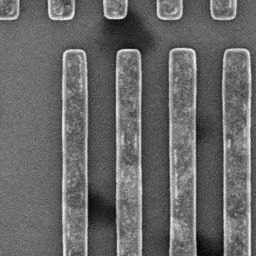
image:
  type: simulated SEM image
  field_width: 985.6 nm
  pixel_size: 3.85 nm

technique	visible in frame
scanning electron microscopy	wiring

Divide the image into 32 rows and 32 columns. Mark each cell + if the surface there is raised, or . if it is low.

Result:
++....+++....+++....+++...+++...
++....+++....+++....+++...+++...
................................
................................
................................
................................
........++.....++....+++....+++.
........+++....+++...+++....+++.
........+++....+++...+++....+++.
........+++....+++...+++....+++.
........+++....+++...+++....+++.
........+++....+++...+++....+++.
........+++....+++...+++....+++.
........+++....+++...+++....+++.
........+++....+++...+++....+++.
........+++....+++...+++....+++.
........+++....+++...+++....+++.
........+++....+++...+++....+++.
........+++....+++...+++....+++.
........+++....+++...+++....+++.
........+++....+++...+++....+++.
........+++....+++...+++....+++.
........+++....+++...+++....+++.
........+++....+++...+++....+++.
........+++....+++...+++....+++.
........+++....+++...+++....+++.
........+++....+++...+++....+++.
........+++....+++...+++....+++.
........+++....+++...+++....+++.
........+++....+++...+++....+++.
........+++....+++...+++....+++.
........+++....+++...+++....+++.